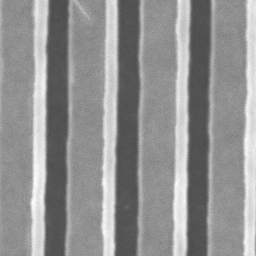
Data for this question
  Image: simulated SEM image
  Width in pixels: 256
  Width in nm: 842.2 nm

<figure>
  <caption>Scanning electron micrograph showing lines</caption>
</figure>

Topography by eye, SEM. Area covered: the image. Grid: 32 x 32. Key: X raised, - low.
XXXXXX---XXXXXX---XXXXXX---XXXXX
XXXXXX---XXXXXX---XXXXXX---XXXXX
XXXXXX---XXXXXX---XXXXXX---XXXXX
XXXXXX---XXXXXX---XXXXXX---XXXXX
XXXXXX---XXXXXX---XXXXXX---XXXXX
XXXXXX---XXXXXX---XXXXXX---XXXXX
XXXXXX---XXXXXX--XXXXXXX---XXXXX
XXXXXX---XXXXXX--XXXXXXX--XXXXXX
XXXXXX---XXXXXX---XXXXX---XXXXXX
XXXXXX---XXXXXX---XXXXX---XXXXXX
XXXXXX---XXXXXX---XXXXX---XXXXXX
XXXXXX---XXXXXX---XXXXX---XXXXXX
XXXXXX---XXXXXX---XXXXX---XXXXXX
XXXXXX---XXXXX---XXXXXX---XXXXXX
XXXXXX---XXXXX---XXXXXX---XXXXXX
XXXXXX---XXXXX---XXXXXX---XXXXXX
XXXXXX---XXXXX---XXXXXX---XXXXXX
XXXXXX---XXXXX---XXXXXX---XXXXXX
XXXXXX--XXXXXX---XXXXXX---XXXXXX
XXXXXX--XXXXXX---XXXXXX---XXXXXX
XXXXXX--XXXXXX---XXXXXX---XXXXXX
XXXXXX---XXXXX---XXXXXX---XXXXXX
XXXXXX--XXXXXX---XXXXXX---XXXXXX
XXXXXX--XXXXXX---XXXXXX---XXXXXX
XXXXXX--XXXXXX---XXXXXX---XXXXXX
XXXXXX--XXXXXX---XXXXXX---XXXXXX
XXXXXX--XXXXXX---XXXXXX---XXXXXX
XXXXXX--XXXXXX---XXXXXX---XXXXXX
XXXXXX--XXXXXX---XXXXXX---XXXXXX
XXXXXX--XXXXXX---XXXXXX---XXXXXX
XXXXXX--XXXXXX---XXXXXX---XXXXXX
XXXXX---XXXXXX---XXXXXX---XXXXXX